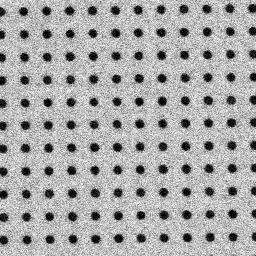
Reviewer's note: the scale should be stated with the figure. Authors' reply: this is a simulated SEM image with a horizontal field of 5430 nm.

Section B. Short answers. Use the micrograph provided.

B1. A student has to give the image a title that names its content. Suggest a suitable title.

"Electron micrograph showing a regular array of holes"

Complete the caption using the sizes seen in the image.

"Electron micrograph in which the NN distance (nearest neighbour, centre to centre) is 480 nm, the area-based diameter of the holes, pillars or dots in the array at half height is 9.24 pixels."